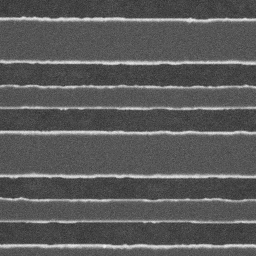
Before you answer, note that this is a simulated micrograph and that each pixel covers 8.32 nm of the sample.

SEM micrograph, lines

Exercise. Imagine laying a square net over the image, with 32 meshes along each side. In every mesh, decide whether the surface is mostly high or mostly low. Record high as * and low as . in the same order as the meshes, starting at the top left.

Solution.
................................
................................
************************..******
********************************
********************************
********************************
********************************
********************************
................................
................................
................................
********************************
********************************
********************************
................................
................................
*****..*****........*........**.
********************************
********************************
********************************
********************************
********************************
................................
................................
................................
********************************
********************************
********************************
................................
................................
................................
********************************